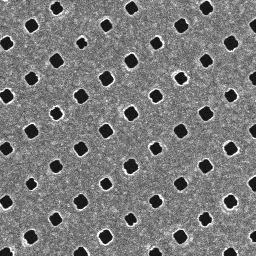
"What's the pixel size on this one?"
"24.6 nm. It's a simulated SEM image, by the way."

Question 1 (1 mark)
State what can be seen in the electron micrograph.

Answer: a regular array of holes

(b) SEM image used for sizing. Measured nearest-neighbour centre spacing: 0.749 micrometres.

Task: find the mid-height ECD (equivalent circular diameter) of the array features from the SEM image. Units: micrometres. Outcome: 0.321